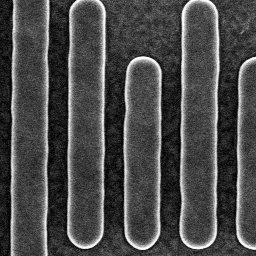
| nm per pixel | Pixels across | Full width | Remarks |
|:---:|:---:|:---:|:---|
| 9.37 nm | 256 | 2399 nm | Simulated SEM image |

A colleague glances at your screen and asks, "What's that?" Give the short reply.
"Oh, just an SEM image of groups of lines, slits or small figures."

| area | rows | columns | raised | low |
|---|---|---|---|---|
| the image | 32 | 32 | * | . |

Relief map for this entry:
..****...****..........****.....
..****...****..........****.....
..****...****..........****.....
..****...****..........****.....
..****...****..........****.....
..****...****..........****.....
..****...****..........****.....
..****...****....**....****....*
..****...****...****...****...**
..****...****...****...****...**
..****...****...****...****...**
..****...****...****...****...**
..****...****...****...****...**
..****...****...****...****...**
..****...****...****...****...**
..****...****...****...****...**
..****...****...****...****...**
..****...****...****...****...**
..****...****...****...****...**
..****...****...****...****...**
..****...****...****...****...**
..****...****...****...****...**
..****...****...****...****...**
.*****...****...****...****...**
..****...****...****...****...**
..****...****...****...****...**
..****...****...****...****...**
..****...****...****...****...**
.*****...****...****...****...**
.*****...****...****...****...**
..****...***....***....***....**
..****..........................